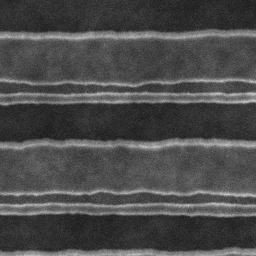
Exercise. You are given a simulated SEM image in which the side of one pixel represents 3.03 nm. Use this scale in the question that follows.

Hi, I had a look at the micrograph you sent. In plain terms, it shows lines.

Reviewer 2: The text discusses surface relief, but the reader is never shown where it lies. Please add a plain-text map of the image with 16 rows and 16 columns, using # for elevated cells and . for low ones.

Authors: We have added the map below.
................
................
################
################
################
################
................
................
................
################
################
################
################
..............#.
................
................